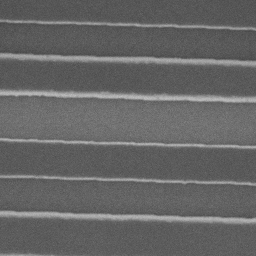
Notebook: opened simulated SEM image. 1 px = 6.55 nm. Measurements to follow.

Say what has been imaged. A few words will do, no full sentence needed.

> lines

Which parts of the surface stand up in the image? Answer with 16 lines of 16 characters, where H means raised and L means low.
HHHHHHHHHHHHHHHH
LLLLHHHHHHHHHHHH
LLLLLLLLLLLLLLLL
HHHHLLLLLLLLLLLL
HHHHHHHHHHHHHHHH
HHHHHHHHHHHHHHHH
LLLLLLLLLLLLLLLL
LLLLLLLLLLLLLLLL
LLLLLLLLLLLLLLLL
HHHHHHHHHHHHHHHH
HHHHHHHHHHHHHHHH
LLLLLLLLLLLLLLHH
LLLLLLLLLLLLLLLL
HHHHHHHHHHLLLLLL
HHHHHHHHHHHHHHHH
HHHHHHHHHHHHHHHH